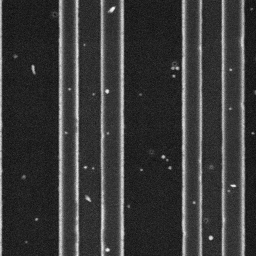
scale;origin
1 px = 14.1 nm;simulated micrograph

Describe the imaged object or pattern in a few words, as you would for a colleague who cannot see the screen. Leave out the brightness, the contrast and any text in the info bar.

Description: lines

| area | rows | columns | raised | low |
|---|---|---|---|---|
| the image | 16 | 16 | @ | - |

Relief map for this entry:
----@@@@---@@@@-
----@@@@----@@@-
----@@@@----@@@-
----@@@@----@@@-
----@@@@---@@@@-
----@@@@---@@@@-
----@@@@----@@@-
----@@@@----@@@-
----@@@@----@@@-
----@@@@----@@@-
----@@@@----@@@-
----@@@@----@@@-
----@@@@----@@@-
----@@@@----@@@-
----@@@@----@@@-
----@@@@----@@@-